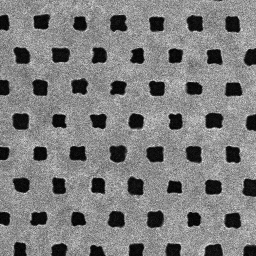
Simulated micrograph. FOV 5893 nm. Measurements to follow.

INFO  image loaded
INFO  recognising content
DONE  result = a regular array of holes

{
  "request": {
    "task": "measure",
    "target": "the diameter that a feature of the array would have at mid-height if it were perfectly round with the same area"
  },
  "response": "0.374 µm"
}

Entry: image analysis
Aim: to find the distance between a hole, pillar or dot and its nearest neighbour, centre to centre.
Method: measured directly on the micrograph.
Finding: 857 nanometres